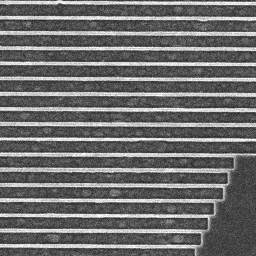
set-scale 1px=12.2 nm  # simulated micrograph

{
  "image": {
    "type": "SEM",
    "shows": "parallel lines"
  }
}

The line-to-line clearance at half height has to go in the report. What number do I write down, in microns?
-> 0.143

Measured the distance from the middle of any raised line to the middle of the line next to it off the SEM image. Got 185 nanometers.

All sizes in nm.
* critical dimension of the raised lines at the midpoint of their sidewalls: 41.1